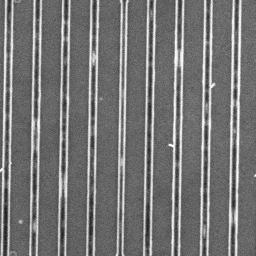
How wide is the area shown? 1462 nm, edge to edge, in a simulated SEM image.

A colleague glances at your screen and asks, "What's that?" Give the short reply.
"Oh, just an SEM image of parallel lines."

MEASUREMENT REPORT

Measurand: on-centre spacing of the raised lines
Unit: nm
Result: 162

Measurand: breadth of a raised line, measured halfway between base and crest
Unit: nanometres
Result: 44.2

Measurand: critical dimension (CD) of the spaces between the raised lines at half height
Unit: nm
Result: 118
